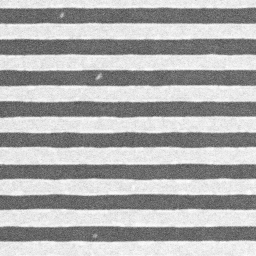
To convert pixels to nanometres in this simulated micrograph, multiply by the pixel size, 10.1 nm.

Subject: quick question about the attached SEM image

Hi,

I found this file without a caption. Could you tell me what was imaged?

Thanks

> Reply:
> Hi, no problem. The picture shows wiring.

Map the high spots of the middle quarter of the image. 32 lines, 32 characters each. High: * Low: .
********************************
................................
................................
................................
................................
................................
********************************
********************************
********************************
................................
................................
................................
................................
.........***..........***.....**
********************************
********************************
********************************
................................
................................
................................
................................
********************************
********************************
********************************
********************************
................................
................................
................................
................................
********************************
********************************
********************************